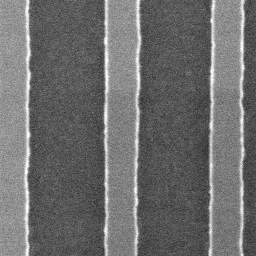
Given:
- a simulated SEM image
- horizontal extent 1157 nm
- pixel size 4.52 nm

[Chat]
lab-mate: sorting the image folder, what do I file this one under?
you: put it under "lines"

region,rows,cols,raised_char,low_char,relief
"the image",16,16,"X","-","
XX-----XX----XX-
XX-----XX----XX-
XX-----XX----XX-
XX-----XX----XX-
XX-----XX----XX-
XX-----XX----XX-
XX-----XX----XX-
XX-----XX----XX-
XX-----XX----XX-
XX-----XX----XX-
XX-----XX----XX-
XX-----XX----XX-
XX-----XX----XX-
XX-----XX----XX-
XX-----XX----XX-
XX-----XX----XX-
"